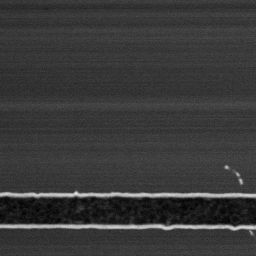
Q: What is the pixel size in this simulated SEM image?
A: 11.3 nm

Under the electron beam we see one or a few lines or trenches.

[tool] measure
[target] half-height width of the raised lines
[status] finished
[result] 368 nanometres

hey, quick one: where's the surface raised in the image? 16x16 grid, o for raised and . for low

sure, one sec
................
................
................
................
................
................
................
................
................
................
................
................
oooooooooooooooo
oooooooooooooooo
................
................